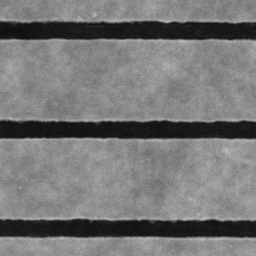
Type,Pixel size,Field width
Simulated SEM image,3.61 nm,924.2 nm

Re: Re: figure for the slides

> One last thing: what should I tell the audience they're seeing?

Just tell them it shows lines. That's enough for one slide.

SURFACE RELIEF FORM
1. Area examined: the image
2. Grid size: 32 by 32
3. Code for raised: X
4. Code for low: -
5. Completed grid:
XXXXXXXXXXXXXXXXXXXXXXXXXXXXXXXX
XXXXXXXXXXXXXXXXXXXXXXXXXXXXXXXX
XXXXXXXXXXXXXXXXXXXXXXXXXXXXXXXX
--------------------------------
--------------------------------
XXXXXXXXXXXXXXXXXXXXXXXXXXXXXXXX
XXXXXXXXXXXXXXXXXXXXXXXXXXXXXXXX
XXXXXXXXXXXXXXXXXXXXXXXXXXXXXXXX
XXXXXXXXXXXXXXXXXXXXXXXXXXXXXXXX
XXXXXXXXXXXXXXXXXXXXXXXXXXXXXXXX
XXXXXXXXXXXXXXXXXXXXXXXXXXXXXXXX
XXXXXXXXXXXXXXXXXXXXXXXXXXXXXXXX
XXXXXXXXXXXXXXXXXXXXXXXXXXXXXXXX
XXXXXXXXXXXXXXXXXXXXXXXXXXXXXXXX
XXXXXXXXXXXXXXXXXXXXXXXXXXXXXXXX
--------------------------------
--------------------------------
XXXXXXXXXXXXXXXXXXXXXXXXXXXXXXXX
XXXXXXXXXXXXXXXXXXXXXXXXXXXXXXXX
XXXXXXXXXXXXXXXXXXXXXXXXXXXXXXXX
XXXXXXXXXXXXXXXXXXXXXXXXXXXXXXXX
XXXXXXXXXXXXXXXXXXXXXXXXXXXXXXXX
XXXXXXXXXXXXXXXXXXXXXXXXXXXXXXXX
XXXXXXXXXXXXXXXXXXXXXXXXXXXXXXXX
XXXXXXXXXXXXXXXXXXXXXXXXXXXXXXXX
XXXXXXXXXXXXXXXXXXXXXXXXXXXXXXXX
XXXXXXXXXXXXXXXXXXXXXXXXXXXXXXXX
-------------XX-----XXXXXX-XXX-X
--------------------------------
--------------------------------
XXXXXXXXXXXXXXXXXXXXXXXXXXXXXXXX
XXXXXXXXXXXXXXXXXXXXXXXXXXXXXXXX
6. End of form